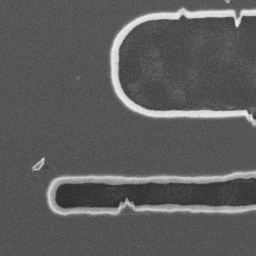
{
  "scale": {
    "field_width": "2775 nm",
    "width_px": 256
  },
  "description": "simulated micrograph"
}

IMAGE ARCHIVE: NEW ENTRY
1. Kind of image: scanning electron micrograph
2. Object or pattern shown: one or a few lines or trenches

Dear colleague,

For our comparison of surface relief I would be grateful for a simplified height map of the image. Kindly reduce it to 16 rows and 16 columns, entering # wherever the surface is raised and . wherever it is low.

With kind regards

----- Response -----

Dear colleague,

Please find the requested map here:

################
########........
#######.........
#######.........
#######.........
#######.........
########........
################
################
################
################
####............
###.............
################
################
################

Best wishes